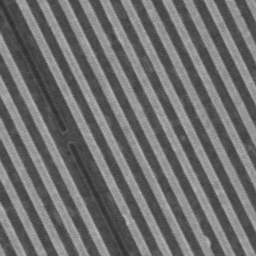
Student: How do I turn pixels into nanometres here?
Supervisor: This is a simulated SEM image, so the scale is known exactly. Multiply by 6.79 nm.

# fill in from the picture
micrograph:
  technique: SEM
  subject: parallel lines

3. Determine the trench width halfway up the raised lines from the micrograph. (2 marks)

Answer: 79.1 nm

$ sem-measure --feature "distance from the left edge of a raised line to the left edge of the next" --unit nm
127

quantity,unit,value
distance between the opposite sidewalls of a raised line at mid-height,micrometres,0.0487